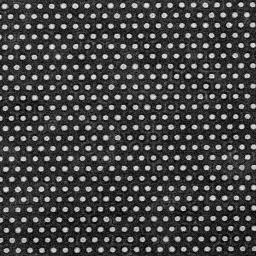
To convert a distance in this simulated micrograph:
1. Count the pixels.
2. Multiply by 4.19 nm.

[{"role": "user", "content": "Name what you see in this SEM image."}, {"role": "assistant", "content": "a regular array of raised bodies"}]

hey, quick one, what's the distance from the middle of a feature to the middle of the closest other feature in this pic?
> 47.9 nm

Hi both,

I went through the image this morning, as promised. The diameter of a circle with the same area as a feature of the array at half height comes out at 0.0217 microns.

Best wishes